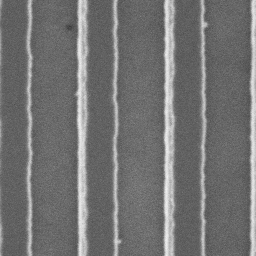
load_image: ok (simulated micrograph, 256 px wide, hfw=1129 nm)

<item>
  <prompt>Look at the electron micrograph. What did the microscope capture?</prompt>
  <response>lines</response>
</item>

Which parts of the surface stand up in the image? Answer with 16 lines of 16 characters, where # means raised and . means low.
##...##...###...
##...##...###...
##...##...###...
##...##...###...
##...##...###...
##...##...###...
##...##...###...
##...##...###...
##...##...###...
##...##...###...
##...##...###...
##...##...###...
##...##...###...
##...##...###...
##...##...###...
##...##...###...